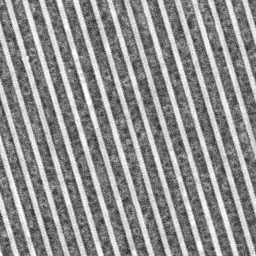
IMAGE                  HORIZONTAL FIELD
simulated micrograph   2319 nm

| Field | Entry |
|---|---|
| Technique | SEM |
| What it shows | parallel lines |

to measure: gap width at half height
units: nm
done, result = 110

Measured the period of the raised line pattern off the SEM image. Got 0.147 micrometres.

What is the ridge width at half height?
0.0336 µm